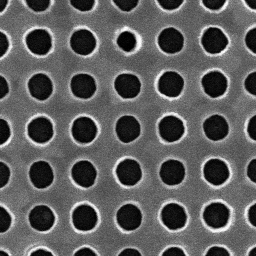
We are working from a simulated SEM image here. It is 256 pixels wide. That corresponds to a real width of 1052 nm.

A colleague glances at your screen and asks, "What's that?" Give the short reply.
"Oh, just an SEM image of a regular array of holes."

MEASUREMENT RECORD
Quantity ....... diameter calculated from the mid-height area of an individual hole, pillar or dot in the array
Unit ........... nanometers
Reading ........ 109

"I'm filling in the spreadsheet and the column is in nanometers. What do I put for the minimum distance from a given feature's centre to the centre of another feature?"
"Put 178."